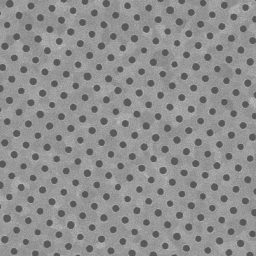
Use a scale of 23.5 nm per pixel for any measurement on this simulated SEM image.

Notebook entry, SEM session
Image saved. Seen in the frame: a regular array of holes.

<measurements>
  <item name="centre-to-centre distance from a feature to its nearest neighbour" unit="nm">351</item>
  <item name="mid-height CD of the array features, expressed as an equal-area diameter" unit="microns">0.172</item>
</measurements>